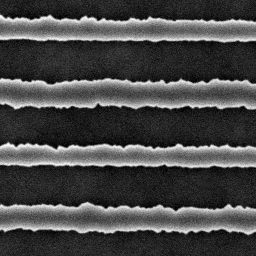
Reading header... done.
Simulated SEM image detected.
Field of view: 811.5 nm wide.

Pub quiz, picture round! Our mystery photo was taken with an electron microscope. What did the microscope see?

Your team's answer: lines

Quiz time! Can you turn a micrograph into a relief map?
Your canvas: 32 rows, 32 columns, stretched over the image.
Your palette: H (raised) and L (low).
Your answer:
LLLLLLLLLLLLLLLLLLLLLLLLLLLLLLLL
LLLLLLLLLLLLLLLLLLLLLLLLLLLLLLLL
HHHHHHHHHLHHHLLLHLHHHLLLLLLLLLLL
HHHHHHHHHHHHHHHHHHHHHHHHHHHHHHHH
HHHHHHHHHHHHHHHHHHHHHHHHHHHHHHHH
LLLLLLLLLLLLLLLLLLLLLLLLLLLLLLLL
LLLLLLLLLLLLLLLLLLLLLLLLLLLLLLLL
LLLLLLLLLLLLLLLLLLLLLLLLLLLLLLLL
LLLLLLLLLLLLLLLLLLLLLLLLLLLLLLLL
LLLLLLLLLLLLLLLLLLLLLLLLLLLLLLLL
HHHHHHLHHHHHHHHHHHHHHHHHHHHHHHHH
HHHHHHHHHHHHHHHHHHHHHHHHHHHHHHHH
HHHHHHHHHHHHHHHHHHHHHHHHHHHHHHHH
LLLLLLLLLLLLLLLLLLLLLLLLLLLLLLLH
LLLLLLLLLLLLLLLLLLLLLLLLLLLLLLLL
LLLLLLLLLLLLLLLLLLLLLLLLLLLLLLLL
LLLLLLLLLLLLLLLLLLLLLLLLLLLLLLLL
LLLLLLLLLLLLLLLLLLLLLLLLLLLLLLLL
HHHHHHHHHHHHHHHHHHHHHHHHHHHHHHHH
HHHHHHHHHHHHHHHHHHHHHHHHHHHHHHHH
HHHHHHHHHHHHHHHHHHHHHHHHHHHHHHHH
LLLLLLLLLLLLLLLLLLLLLLLLLLLLLLLL
LLLLLLLLLLLLLLLLLLLLLLLLLLLLLLLL
LLLLLLLLLLLLLLLLLLLLLLLLLLLLLLLL
LLLLLLLLLLLLLLLLLLLLLLLLLLLLLLLL
LLLLLLLLLLHLLLLLLLLLLLLLLLLLLLLL
HHHHHHHHHHHHHHHHHHHHHHHHHHHHHHHH
HHHHHHHHHHHHHHHHHHHHHHHHHHHHHHHH
HHHHHHHHHHHHHHHHHHHHHHHHHHHHHHHH
LLLLLLLLLLLLLLLLLLLLLLLLLLLLLLLL
LLLLLLLLLLLLLLLLLLLLLLLLLLLLLLLL
LLLLLLLLLLLLLLLLLLLLLLLLLLLLLLLL